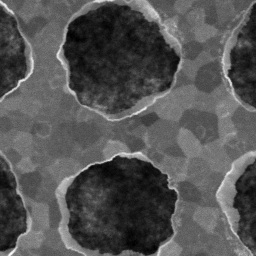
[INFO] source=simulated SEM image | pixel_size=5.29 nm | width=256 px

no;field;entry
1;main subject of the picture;holes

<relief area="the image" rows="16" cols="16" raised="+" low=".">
++++++...+++++++
.+++......+++++.
..++.......++++.
..++.......+++..
..++.......+++..
.+++.......++++.
+++++....++++++.
++++++++++++++++
++++++++++++++++
++++++++++++++++
.++++.....+++++.
.+++.......++++.
.+++.......+++..
..++.......++++.
.+++.......++++.
.++++.....+++++.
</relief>